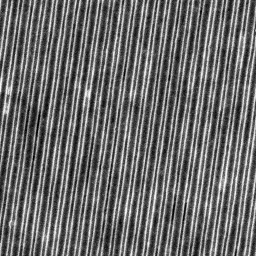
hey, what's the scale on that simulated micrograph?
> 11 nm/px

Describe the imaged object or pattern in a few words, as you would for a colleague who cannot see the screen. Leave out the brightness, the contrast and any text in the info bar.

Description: parallel lines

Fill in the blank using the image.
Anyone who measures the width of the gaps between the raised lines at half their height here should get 38.3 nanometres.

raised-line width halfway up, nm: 84.7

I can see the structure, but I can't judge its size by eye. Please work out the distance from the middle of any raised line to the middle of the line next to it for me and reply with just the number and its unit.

124 nm